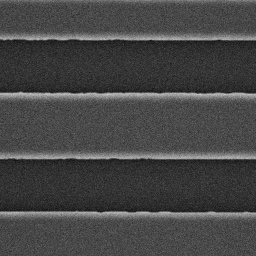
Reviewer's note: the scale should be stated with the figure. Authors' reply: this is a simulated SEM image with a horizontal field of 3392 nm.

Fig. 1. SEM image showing lines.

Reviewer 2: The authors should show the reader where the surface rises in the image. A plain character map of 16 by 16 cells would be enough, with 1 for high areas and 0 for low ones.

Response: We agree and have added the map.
1111111111111111
1111111111111111
0000000000000000
0000000000000000
0000000000000000
0000000000000000
1111111111111111
1111111111111111
1111111111111111
1111111111111111
0000000000000000
0000000000000000
0000000000000000
1111111111111111
1111111111111111
1111111111111111